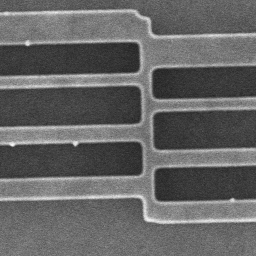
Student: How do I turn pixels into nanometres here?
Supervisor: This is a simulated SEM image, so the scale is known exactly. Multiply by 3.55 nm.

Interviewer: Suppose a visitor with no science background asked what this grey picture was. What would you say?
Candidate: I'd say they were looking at groups of lines, slits or small figures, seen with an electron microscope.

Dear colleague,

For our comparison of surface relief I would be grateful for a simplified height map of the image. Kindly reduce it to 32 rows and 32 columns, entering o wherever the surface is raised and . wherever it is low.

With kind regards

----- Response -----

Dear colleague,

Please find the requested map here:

................................
.......oooooooooo...............
ooooooooooooooooooo.............
ooooooooooooooooooo.............
oooooooooooooooooooo...ooooooooo
oooo.............ooooooooooooooo
..................oooooooooooooo
..................oooooooooooooo
.................ooo............
....ooooooooooooooo.............
ooooooooooooooooooo.............
..................o.............
..................oooooooooooooo
..................oooooooooooooo
..................o.............
.................oo.............
ooooooooooooooooooo.............
ooooooooooooooooooo.............
..................o.............
..................oooooooooooooo
..................oooooooooooooo
..................o.............
ooooooooooooooooooo.............
ooooooooooooooooooo.............
ooooooooooooooooooo.............
..................oooooooooooooo
..................oooooooooooooo
..................oooooooooooooo
................................
................................
................................
................................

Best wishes